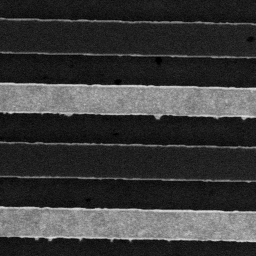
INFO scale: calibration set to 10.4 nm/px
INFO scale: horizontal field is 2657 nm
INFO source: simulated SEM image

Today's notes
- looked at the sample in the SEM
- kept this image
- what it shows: lines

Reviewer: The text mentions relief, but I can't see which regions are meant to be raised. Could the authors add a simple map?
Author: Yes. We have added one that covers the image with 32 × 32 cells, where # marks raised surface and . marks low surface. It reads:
................................
................................
#####...........................
################################
################################
################################
################################
................................
................................
................................
................................
################################
################################
################################
.......................#########
................................
................................
................................
################################
################################
################################
################################
....................############
................................
................................
................................
############################....
################################
################################
################################
................................
................................